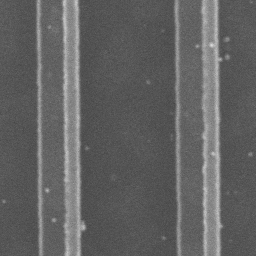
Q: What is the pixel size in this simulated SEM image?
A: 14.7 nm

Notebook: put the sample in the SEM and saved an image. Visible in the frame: lines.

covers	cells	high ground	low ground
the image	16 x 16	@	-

--@@@------@@@--
--@@@------@@@--
--@@@------@@@--
--@@@------@@@--
--@@@------@@@--
--@@@------@@@--
--@@@------@@@--
--@@@------@@@--
--@@@------@@@--
--@@@------@@@--
---@@------@@@--
---@@------@@@--
---@@------@@@--
---@@------@@@--
---@@------@@@--
---@@------@@@--